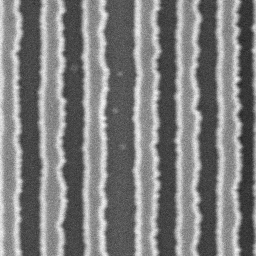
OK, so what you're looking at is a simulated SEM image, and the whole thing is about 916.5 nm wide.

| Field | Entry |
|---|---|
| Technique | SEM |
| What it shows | lines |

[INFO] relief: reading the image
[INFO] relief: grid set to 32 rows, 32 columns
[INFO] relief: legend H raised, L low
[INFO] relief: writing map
HHLLLHHHLLHHHLLLLHHHLLHHHLLHHHLL
HHLLLHHHLLHHHLLLLHHHLLHHHLLHHHLL
HHHLLHHHLLHHHLLLLHHHLLHHHLLHHHLL
HHHLLHHHLLHHHLLLLHHHLLHHHLLHHHLL
HHHLLHHHLLHHHLLLLHHHLLHHHLLHHHLL
HHLLLHHHLLLHHLLLLHHHLLHHHLLHHHLL
HHLLLHHHLLHHHLLLLHHHLLHHHLLHHHLL
HHLLLHHHLLHHHLLLLHHHLLHHHLLHHHLL
HHLLLHHHLLLHHLLLLHHHLLHHHLLHHHLL
HHLLLHHHLLLHHLLLLHHHLLHHLLLHHHLL
HHLLLHHHLLLHHLLLLHHHLLHHHLLHHHLL
HHLLLHHHLLLHHLLLLHHHLLHHHLLHHHLL
HHLLLHHHLLHHHLLLLHHHLLHHHLLHHHLL
HHLLLHHHLLLHHLLLLHHHLLHHHLLHHHLL
HHLLLHHHLLLHHLLLLHHHLLHHHLLHHHLL
HHHLLHHHLLLHHLLLLHHHLLHHHLLHHHLL
HHHLLHHHLLLHHLLLLHHHLLHHHLLHHHLL
HHLLLHHHLLLHHLLLLHHHLLHHHLLHHHLL
HHHLLHHHLLHHHLLLLHHLLLHHHLLHHHLL
HHHLLHHHLLLHHLLLLHHHLLHHHLLHHHLL
HHHLLHHHLLLHHLLLLHHHLLHHHLLHHHLL
HHHLLHHHLLLHHLLLLHHHLLHHHLLHHHLL
HHHLLHHHLLLHHLLLLHHHLLHHHLLHHHLL
HHHLLHHHLLHHHLLLLHHHLLHHHLLHHHLL
HHLLLHHHLLHHHLLLLHHHLLHHHLLHHHLL
HHLLLHHHLLLHHLLLLHHHLLHHHLLHHHLL
HHLLLHHHLLLHHLLLLHHHLLHHHLLHHHLL
HHHLLHHHLLLHHLLLLHHLLLHHHLLHHHLL
HHLLLHHHLLLHHLLLLHHHLLHHHLLHHHLL
HHLLLHHHLLLHHLLLLHHLLLHHHLLHHHLL
HHLLLHHHLLLHHLLLLHHHLLHHHLLHHHLL
HHHLLHHHLLLHHLLLLHHHLLHHHLLHHHLL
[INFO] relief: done